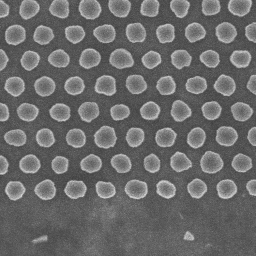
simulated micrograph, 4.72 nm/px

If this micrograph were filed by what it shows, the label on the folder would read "a regular array of raised bodies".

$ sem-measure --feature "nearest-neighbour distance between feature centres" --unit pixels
29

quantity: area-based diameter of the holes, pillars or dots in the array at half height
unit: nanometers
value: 90.7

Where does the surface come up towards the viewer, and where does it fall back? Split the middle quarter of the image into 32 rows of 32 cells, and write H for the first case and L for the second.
HLLLLHHHLLLLHHHHLLLLHHHLLLLLHHHL
LLLLLLLLLLLLLLLLLLLLLLLLLLLLLLLL
LLLLLLLLLLLLLLLLLLLLLLLLLLLLLLLL
LLHHLLLLLHHHLLLLHHHHLLLLHHHLLLLL
LHHHHLLLHHHHHLLLHHHHLLLHHHHLLLLH
HHHHHLLLHHHHHLLLHHHHLLLHHHHHLLLH
HHHHHLLLHHHHHLLLHHHHLLLLHHHHLLLH
LHHHLLLLLLHHLLLLLLLLLLLLHHHLLLLL
LLLLLLLLLLLLLLLLLLLLLLLLLLLLLLLL
LLLLLLLLLLLLLLLLLLLLLHLLLLLLHLLL
HLLLHHHHLLLLLHHLLLLLHHHLLLLHHHHL
HLLLHHHHHLLLHHHHLLLHHHHHLLLHHHHH
HLLLHHHHHLLLHHHHLLLHHHHHLLLHHHHH
HLLLHHHHLLLLHHHLLLLLHHHLLLLLHHHL
LLLLLLLLLLLLLLLLLLLLLLLLLLLLLLLL
LLLLLLLLLLLLLLLLLLLLLLLLLLLLLLLL
LLHHLLLLLHHHLLLLHHHLLLLLHHHLLLLL
LHHHHLLLHHHHHLLLHHHHLLLHHHHHLLLH
LHHHHLLLHHHHHLLLHHHHLLLHHHHHLLLH
LHHHHLLLHHHHHLLLHHHHLLLHHHHLLLLH
LLHHLLLLHHHHLLLLLHHLLLLLLHLLLLLL
LLLLLLLLLLLLLLLLLLLLLLLLLLLLLLLL
LLLLLLLLLLLLLLLLLLLLLLLLLLLLHHLL
LLLLLHHHHLLLHHHHLLLLHHHLLLLHHHHL
HLLLHHHHHLLLHHHHHLLLHHHHLLLHHHHH
HLLLHHHHHLLLHHHHHLLLHHHHLLLHHHHH
HLLLLHHHHLLLLHHHLLLLLHHLLLLLHHLL
LLLLLLLLLLLLLLLLLLLLLLLLLLLLLLLL
LLLLLLLLLLLLLLLLLLLLLLLLLLLLLLLL
LHHHLLLLLHLLLLLLHHHHLLLLHHLLLLLL
LHHHHLLLHHHHLLLHHHHHHLLHHHHLLLLH
HHHHHHLLHHHHHLLHHHHHHLLLHHHHLLLH